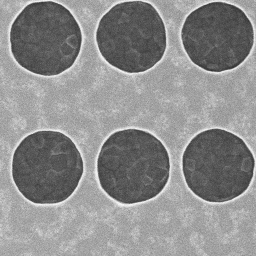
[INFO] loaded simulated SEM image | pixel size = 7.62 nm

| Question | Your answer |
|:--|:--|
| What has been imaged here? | holes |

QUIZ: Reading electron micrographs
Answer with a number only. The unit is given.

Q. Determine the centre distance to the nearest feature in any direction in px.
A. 85.6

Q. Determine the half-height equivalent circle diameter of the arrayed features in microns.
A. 0.553